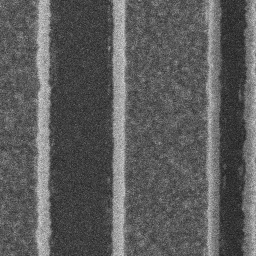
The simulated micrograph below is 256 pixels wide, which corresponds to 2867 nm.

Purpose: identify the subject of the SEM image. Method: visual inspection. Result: one or a few lines or trenches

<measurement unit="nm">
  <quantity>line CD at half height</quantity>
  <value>1060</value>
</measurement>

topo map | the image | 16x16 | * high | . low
***....******...
***....******...
***....******...
***....******...
***....******...
***....******...
***....******...
***....******...
***....******...
***....******...
***....******...
***....******...
***....******...
***....******...
***....******...
***....******...